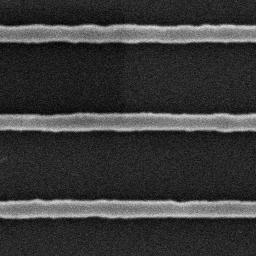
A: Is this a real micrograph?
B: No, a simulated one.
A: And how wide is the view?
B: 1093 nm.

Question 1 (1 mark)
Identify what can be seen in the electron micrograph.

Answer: lines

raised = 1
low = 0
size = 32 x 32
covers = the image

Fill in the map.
00000000000000000000000000000000
00000000000000000000000000000000
00000000000000000000000000000000
11111111111111111111111111111111
11111111111111111111111111111111
00000000000000000000000000000000
00000000000000000000000000000000
00000000000000000000000000000000
00000000000000000000000000000000
00000000000000000000000000000000
00000000000000000000000000000000
00000000000000000000000000000000
00000000000000000000000000000000
00000000000000000000000000000000
11111111111111111111111111111111
11111111111111111111111111111111
00000000000000000000000000000000
00000000000000000000000000000000
00000000000000000000000000000000
00000000000000000000000000000000
00000000000000000000000000000000
00000000000000000000000000000000
00000000000000000000000000000000
00000000000000000000000000000000
00000000000000000000000000000000
11111111111111111111111111111111
11111111111111111111111111111111
00000000000000000000000000000000
00000000000000000000000000000000
00000000000000000000000000000000
00000000000000000000000000000000
00000000000000000000000000000000